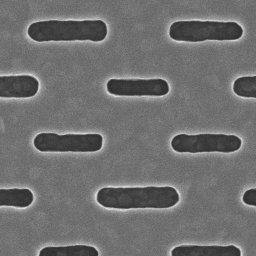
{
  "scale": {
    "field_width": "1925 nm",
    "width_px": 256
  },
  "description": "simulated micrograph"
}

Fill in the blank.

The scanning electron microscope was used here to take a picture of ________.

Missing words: holes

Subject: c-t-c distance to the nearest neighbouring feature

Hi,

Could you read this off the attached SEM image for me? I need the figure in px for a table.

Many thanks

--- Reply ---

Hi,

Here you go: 87.4